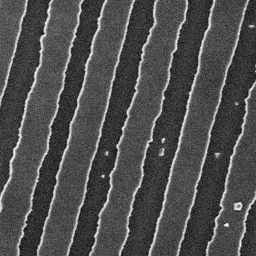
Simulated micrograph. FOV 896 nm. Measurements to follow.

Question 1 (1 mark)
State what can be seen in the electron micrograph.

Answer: lines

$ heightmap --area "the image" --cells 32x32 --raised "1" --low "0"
11100011110001111001111000011110
11100011110001110001111000111110
11100011110011110001111000111100
11100011110011110001111000111100
11000111100011110001110000111100
11000111100111100011110001111100
11000111100111100011110001111000
11000111100111100011100001111000
10000111000111100111100001111000
10001111000111000111100011110000
10001111001111000111100011110000
10001111001111000111100011110001
00011110001111000111000011110001
00011110001110001111000111100001
00011110011110001111000111100001
00011100011110001110000111100011
00111100011110011110000111000011
00111100111100011110001111000011
00111100111100011100001111000111
00111100111100011100001111000111
01111000111000111100001110000111
01111001111000111100011110001111
01111001111000111100011110001111
01110001111000111000011110001111
11110001111001111000011100001111
11110011110001111000111100001111
11110011110001110000111100011110
11100011110011110000111100011110
11100111110011110000111000011110
11100111100011110001111000011100
11000111100011110001111000111100
11000111100111100001110000111100